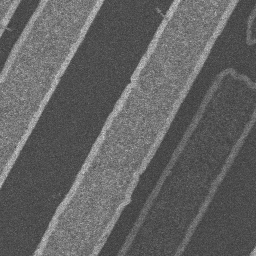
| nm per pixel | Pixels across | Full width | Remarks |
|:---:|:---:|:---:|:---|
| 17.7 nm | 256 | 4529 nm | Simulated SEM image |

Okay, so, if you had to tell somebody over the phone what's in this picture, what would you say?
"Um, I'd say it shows one or a few lines or trenches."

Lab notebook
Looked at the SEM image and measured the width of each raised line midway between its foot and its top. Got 0.865 µm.